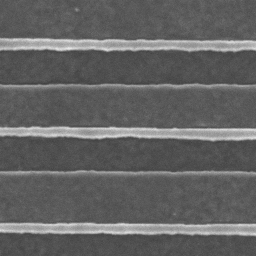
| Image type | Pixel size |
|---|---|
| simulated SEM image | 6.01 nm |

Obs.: lines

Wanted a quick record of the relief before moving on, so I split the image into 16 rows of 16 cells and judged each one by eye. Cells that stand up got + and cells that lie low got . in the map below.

++++++++++++++++
++++++++++++++++
++++++++++++++++
................
................
++++++++++++++++
++++++++++++++++
++++++++++++++++
.+++++++++++++++
................
................
++++++++++++++++
++++++++++++++++
++++++++++++++++
++++++++++++++++
................